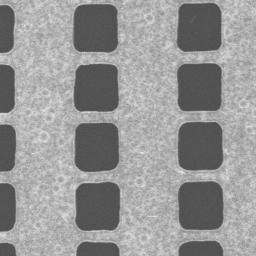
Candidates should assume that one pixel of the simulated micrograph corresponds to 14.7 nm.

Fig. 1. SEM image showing a regular array of holes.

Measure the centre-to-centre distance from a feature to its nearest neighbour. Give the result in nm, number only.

872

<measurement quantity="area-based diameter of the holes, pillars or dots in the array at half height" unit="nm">756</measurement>